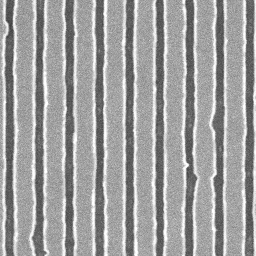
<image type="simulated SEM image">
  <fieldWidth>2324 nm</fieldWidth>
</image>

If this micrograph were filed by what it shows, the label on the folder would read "parallel lines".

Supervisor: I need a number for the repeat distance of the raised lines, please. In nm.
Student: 273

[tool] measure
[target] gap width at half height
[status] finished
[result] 84 nanometres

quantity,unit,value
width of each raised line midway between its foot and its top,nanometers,186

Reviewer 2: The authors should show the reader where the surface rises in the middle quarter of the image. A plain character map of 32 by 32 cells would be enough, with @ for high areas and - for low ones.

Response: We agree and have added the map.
---@@@@@--@@@@@--@@@@@@--@@@@@--
---@@@@@--@@@@@--@@@@@@--@@@@@--
---@@@@@--@@@@@---@@@@@--@@@@@--
---@@@@@--@@@@@---@@@@@--@@@@@--
---@@@@@--@@@@@---@@@@@--@@@@@--
---@@@@---@@@@@---@@@@@--@@@@@--
---@@@@---@@@@@---@@@@@--@@@@@--
---@@@@---@@@@@---@@@@@--@@@@@--
---@@@@---@@@@@---@@@@@--@@@@@--
---@@@@@--@@@@@---@@@@@--@@@@@--
---@@@@@--@@@@@--@@@@@@--@@@@@--
---@@@@@--@@@@@--@@@@@@--@@@@@--
---@@@@@--@@@@@--@@@@@@--@@@@@--
---@@@@@--@@@@@---@@@@@--@@@@@--
---@@@@@--@@@@@---@@@@@--@@@@@--
---@@@@@--@@@@@---@@@@@--@@@@@--
---@@@@@--@@@@@--@@@@@@--@@@@@--
---@@@@@--@@@@@---@@@@@--@@@@@--
---@@@@@--@@@@@---@@@@@--@@@@@--
---@@@@@--@@@@@---@@@@@--@@@@@--
---@@@@@--@@@@@---@@@@@--@@@@@--
---@@@@@--@@@@@---@@@@@--@@@@@--
---@@@@@--@@@@@---@@@@@--@@@@@--
---@@@@@--@@@@@---@@@@@--@@@@@--
---@@@@@--@@@@@---@@@@@--@@@@@--
---@@@@@--@@@@@---@@@@@--@@@@@@-
---@@@@@--@@@@@---@@@@@--@@@@@--
---@@@@@--@@@@@---@@@@@--@@@@@--
---@@@@@--@@@@@---@@@@@--@@@@@--
---@@@@@--@@@@@---@@@@@--@@@@@--
---@@@@@--@@@@@---@@@@@--@@@@@--
---@@@@@--@@@@@---@@@@@--@@@@@--